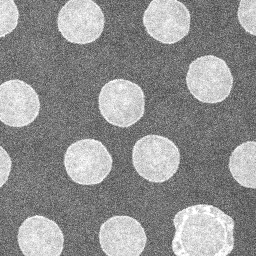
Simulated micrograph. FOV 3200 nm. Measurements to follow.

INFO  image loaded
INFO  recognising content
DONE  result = raised bodies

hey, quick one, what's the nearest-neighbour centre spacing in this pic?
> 0.832 microns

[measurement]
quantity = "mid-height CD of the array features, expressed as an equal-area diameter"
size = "0.577 micrometres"